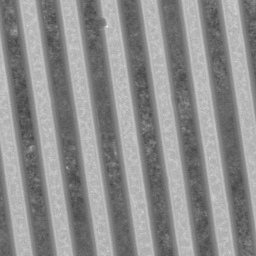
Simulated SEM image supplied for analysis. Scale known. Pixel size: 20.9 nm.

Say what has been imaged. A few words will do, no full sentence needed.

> parallel lines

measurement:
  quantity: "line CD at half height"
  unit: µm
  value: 0.371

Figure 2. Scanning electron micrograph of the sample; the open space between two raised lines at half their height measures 0.451 microns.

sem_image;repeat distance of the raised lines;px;40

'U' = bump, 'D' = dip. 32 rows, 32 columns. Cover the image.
DDUUUDDUUUDDUUUDDDUUDDDUUDDDUUDD
DDUUUDDDUUDDDUUDDDUUDDDUUDDDUUDD
DDDUUDDDUUDDDUUDDDUUDDDUUDDDUUDD
DDDUUDDDUUDDDUUDDDUUDDDUUDDDUUDD
DDDUUDDDUUDDDUUDDDUUDDDUUDDDUUDD
DDDUUDDDUUDDDUUUDDUUUDDUUUDDUUUD
DDDUUUDDUUUDDUUUDDUUUDDUUUDDDUUD
UDDUUUDDUUUDDDUUDDDUUDDDUUDDDUUD
UDDDUUDDDUUDDDUUDDDUUDDDUUDDDUUD
UDDDUUDDDUUDDDUUDDDUUDDDUUDDDUUD
UDDDUUDDDUUDDDUUDDDUUDDDUUDDDUUD
UDDDUUDDDUUDDDUUDDDUUDDDUUUDDUUU
UDDDUUDDDUUDDDUUUDDUUUDDUUUDDUUU
UDDDUUUDDUUUDDUUUDDDUUDDUUUDDDUU
UUDDUUUDDUUUDDDUUDDDUUDDDUUDDDUU
UUDDDUUDDDUUDDDUUDDDUUDDDUUDDDUU
UUDDDUUDDDUUDDDUUDDDUUDDDUUDDDUU
UUDDDUUDDDUUDDDUUDDDUUDDDUUDDDUU
UUDDDUUDDDUUDDDUUUDDUUDDDUUUDDUU
UUDDDUUDDDUUDDDUUUDDUUUDDUUUDDUU
UUDDDUUUDDUUUDDUUUDDDUUDDDUUDDDU
UUUDDDUUDDUUUDDDUUDDDUUDDDUUDDDU
DUUDDDUUDDDUUDDDUUDDDUUDDDUUDDDU
DUUDDDUUDDDUUDDDUUDDDUUDDDUUDDDU
DUUDDDUUDDDUUDDDUUDDDUUDDDUUDDDU
DUUDDDUUDDDUUDDDUUUDDUUUDDUUUDDU
DUUDDDUUDDDUUUDDUUUDDUUUDDUUUDDD
DUUUDDUUUDDUUUDDUUUDDDUUDDDUUDDD
DUUUDDDUUDDDUUDDDUUDDDUUDDDUUDDD
DDUUDDDUUDDDUUDDDUUDDDUUDDDUUDDD
DDUUDDDUUDDDUUDDDUUDDDUUDDDUUDDD
DDUUDDDUUDDDUUDDDUUDDDUUDDDUUDDD